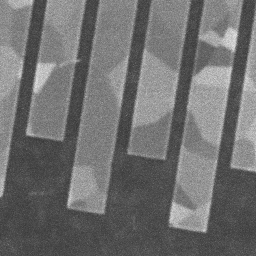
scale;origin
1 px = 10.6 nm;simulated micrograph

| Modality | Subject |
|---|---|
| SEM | parallel lines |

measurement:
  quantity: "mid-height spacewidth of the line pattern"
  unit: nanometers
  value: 158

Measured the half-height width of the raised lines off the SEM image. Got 395 nm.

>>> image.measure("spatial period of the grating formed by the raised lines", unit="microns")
0.556